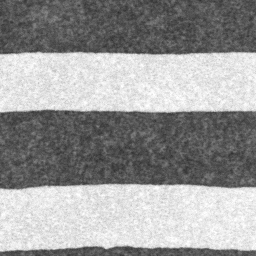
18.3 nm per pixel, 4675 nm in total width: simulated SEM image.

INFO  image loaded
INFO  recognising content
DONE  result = one or a few lines or trenches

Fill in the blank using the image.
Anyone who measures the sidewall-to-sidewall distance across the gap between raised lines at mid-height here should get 1360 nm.